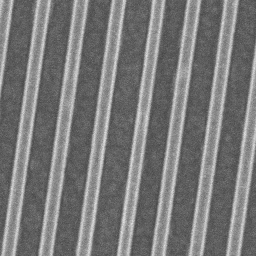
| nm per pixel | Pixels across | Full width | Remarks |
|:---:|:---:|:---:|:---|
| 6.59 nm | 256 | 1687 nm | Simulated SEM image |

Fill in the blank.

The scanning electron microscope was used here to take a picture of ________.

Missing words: parallel lines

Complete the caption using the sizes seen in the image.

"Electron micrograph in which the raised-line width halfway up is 0.0768 µm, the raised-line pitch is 245 nanometers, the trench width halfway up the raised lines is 166 nanometres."